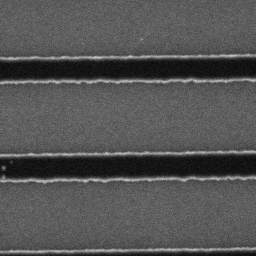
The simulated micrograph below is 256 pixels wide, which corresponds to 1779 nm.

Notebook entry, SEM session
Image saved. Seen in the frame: lines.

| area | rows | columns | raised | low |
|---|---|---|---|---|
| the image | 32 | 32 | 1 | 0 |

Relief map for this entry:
00000000000000000000000000000000
00000000000000000000000000000000
00000000000000000000000000000000
00000000000000000000000000000000
00000000000000000000000000000000
00000000000000000000000000000000
00000000000000000000000000000000
11111111111111111111111111111111
11111111111111111111111111111111
11111111111111111111111111111111
00000000000000000000000000000000
00000000000000000000000000000000
00000000000000000000000000000000
00000000000000000000000000000000
00000000000000000000000000000000
00000000000000000000000000000000
00000000000000000000000000000000
00000000000000000000000000000000
00000000000000000000000000000000
11111111111111111111111111111111
11111111111111111111111111111111
11111111111111111111111111111111
11111111111111011100000000000000
00000000000000000000000000000000
00000000000000000000000000000000
00000000000000000000000000000000
00000000000000000000000000000000
00000000000000000000000000000000
00000000000000000000000000000000
00000000000000000000000000000000
00000000000000000000000000000000
11111111111111111111111111111111